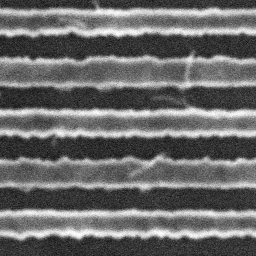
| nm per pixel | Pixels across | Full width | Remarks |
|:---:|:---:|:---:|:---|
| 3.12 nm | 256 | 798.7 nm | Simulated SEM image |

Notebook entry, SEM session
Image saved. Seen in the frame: lines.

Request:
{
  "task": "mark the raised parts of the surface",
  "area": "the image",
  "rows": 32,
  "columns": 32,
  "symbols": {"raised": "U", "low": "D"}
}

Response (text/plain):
DDDDDDDDDDDDDDDDDDDDDDDDDDDDDDDD
UUUUUUUUUUUUUUUDUUUUUUUUUUUUUUUU
UUUUUUUUUUUUUUUUUUUUUUUUUUUUUUUU
UUUUUUUUUUUUUUUUUUUUUUUUUUUUUUUU
DDDDDDDDDDDDDDDDDDDDDDDDDDDDDDDD
DDDDDDDDDDDDDDDDDDDDDDDDDDDDDDDD
DDDDDDDDDDDDDDDDDDDDDDDDDDDDDDDD
UUUUDUUUUDDUUUUUUUUUUUUUUUUUUUUU
UUUUUUUUUUUUUUUUUUUUUUUUUUUUUUUU
UUUUUUUUUUUUUUUUUUUUUUUUUUUUUUUU
UUUUUUUUUUUUUUUUUUUUUUUUUUUUUUUU
DDDDDDDDDDDDDDDDDDDDDDDDDDDDDDDD
DDDDDDDDDDDDDDDDDDDDDDDDDDDDDDDD
DDDDDDDDDDDDDDDDDDDDDDDDDDDDDDDD
UUUUUUUUUUUUUUUUUUUUUUUUUUUUUUUU
UUUUUUUUUUUUUUUUUUUUUUUUUUUUUUUU
UUUUUUUUUUUUUUUUUUUUUUUUUUUUUUUU
DDDDDDDDDDDDDDDDDDDDDDDDDDDDDDDD
DDDDDDDDDDDDDDDDDDDDDDDDDDDDDDDD
DDDDDDDDDDDDDDDDDDDDDDDDDDDDDDDD
UUUUUUUUUUUUUUUUUUUUUUUUUUUUUUUU
UUUUUUUUUUUUUUUUUUUUUUUUUUUUUUUU
UUUUUUUUUUUUUUUUUUUUUUUUUUUUUUUU
DDDDDDDDDDDDDDDDDDDDDDDDDDDDDDDD
DDDDDDDDDDDDDDDDDDDDDDDDDDDDDDDD
DDDDDDDDDDDDDDDDDDDDDDDDDDDDDDDD
DDUUUUUDDDDUDDDUUUDUDDUUUUDDDDDU
UUUUUUUUUUUUUUUUUUUUUUUUUUUUUUUU
UUUUUUUUUUUUUUUUUUUUUUUUUUUUUUUU
DUUDDDDDDUDDDDUDDDUDDUDDUUDUDDDD
DDDDDDDDDDDDDDDDDDDDDDDDDDDDDDDD
DDDDDDDDDDDDDDDDDDDDDDDDDDDDDDDD